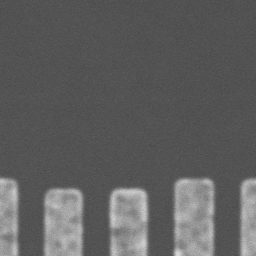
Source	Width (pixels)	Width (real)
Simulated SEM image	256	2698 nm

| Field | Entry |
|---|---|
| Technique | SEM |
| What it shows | wiring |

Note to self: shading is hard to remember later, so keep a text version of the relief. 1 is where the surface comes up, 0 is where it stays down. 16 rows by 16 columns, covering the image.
0000000000000000
0000000000000000
0000000000000000
0000000000000000
0000000000000000
0000000000000000
0000000000000000
0000000000000000
0000000000000000
0000000000000000
0000000000000000
1000000000011001
1001100110011001
1001100110011001
1001100110011001
1001100110011001